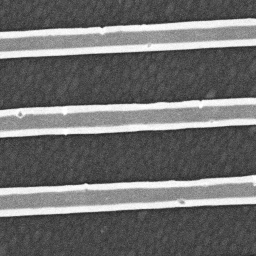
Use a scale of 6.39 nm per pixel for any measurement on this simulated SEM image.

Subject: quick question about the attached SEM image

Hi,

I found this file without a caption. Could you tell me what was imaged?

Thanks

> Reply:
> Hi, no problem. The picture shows one or a few lines or trenches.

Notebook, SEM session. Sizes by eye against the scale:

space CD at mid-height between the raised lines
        363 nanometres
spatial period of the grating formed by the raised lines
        503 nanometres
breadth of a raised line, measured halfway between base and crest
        21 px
